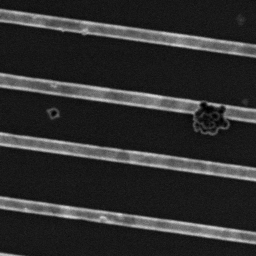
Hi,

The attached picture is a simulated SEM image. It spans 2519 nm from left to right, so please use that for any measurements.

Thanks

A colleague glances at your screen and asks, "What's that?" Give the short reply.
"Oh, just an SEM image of one or a few lines or trenches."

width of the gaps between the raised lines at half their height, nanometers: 522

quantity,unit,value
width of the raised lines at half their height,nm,101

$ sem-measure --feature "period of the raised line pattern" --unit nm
607